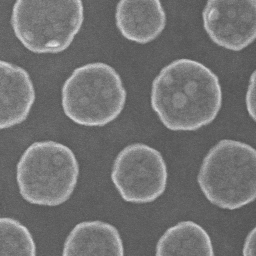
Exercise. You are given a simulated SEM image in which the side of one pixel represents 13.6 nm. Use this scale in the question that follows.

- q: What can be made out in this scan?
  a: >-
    raised bodies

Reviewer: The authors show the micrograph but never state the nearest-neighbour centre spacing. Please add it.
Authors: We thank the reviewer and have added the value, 1240 nm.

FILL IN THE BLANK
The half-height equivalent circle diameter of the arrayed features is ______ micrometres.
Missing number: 0.815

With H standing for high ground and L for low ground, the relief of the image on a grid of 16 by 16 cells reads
LHHHHLLLHHLLLHHH
LHHHHLLHHHLLLHHH
LHHHLLLLLLLLLLHH
LLLLLLLLLLLLLLLL
HLLLLHHLLLHHHLLL
HHLLHHHHLLHHHHLL
HHLLHHHHLLHHHHLL
HLLLLHHLLLHHHLLL
LLLLLLLLLLLLLLLL
LLHHLLLLHHLLLHHH
LHHHHLLHHHLLLHHH
LHHHHLLHHHLLLHHH
LLHHLLLLHLLLLHHH
LLLLLLLLLLLLLLLL
HHLLLHHLLLLHHLLL
HHLLHHHHLLHHHLLH